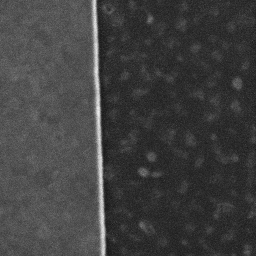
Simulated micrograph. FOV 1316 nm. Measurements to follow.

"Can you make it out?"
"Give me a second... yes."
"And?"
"one or a few lines or trenches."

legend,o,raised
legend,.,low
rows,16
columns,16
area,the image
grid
oooooo..........
oooooo..........
oooooo..........
oooooo..........
oooooo..........
oooooo..........
oooooo..........
oooooo..........
oooooo..........
oooooo..........
oooooo..........
oooooo..........
oooooo..........
oooooo..........
oooooo..........
oooooo..........